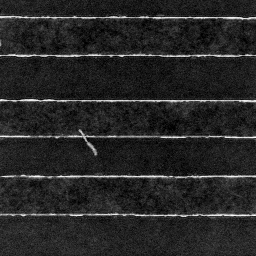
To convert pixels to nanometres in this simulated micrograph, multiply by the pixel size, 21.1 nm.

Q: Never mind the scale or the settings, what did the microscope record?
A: lines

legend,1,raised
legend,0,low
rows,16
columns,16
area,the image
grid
0000000000000000
1111111111111111
1111111111111111
0000000000000000
0000000000000000
0000000000000000
1111111111111111
1111111111111111
1111111111111111
0000000000000000
0000000000000000
1111111111111111
1111111111111111
0000000000110000
0000000000000000
0000000000000000